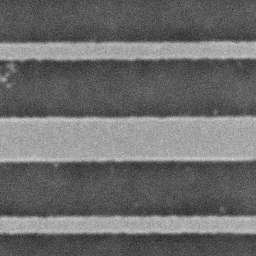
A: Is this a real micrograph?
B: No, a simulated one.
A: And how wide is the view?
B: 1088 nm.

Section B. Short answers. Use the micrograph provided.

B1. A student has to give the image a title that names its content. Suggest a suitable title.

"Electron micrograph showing lines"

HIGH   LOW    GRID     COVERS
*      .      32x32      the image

................................
................................
................................
................................
................................
...*.***************************
********************************
................................
................................
................................
................................
................................
................................
................................
................................
********************************
********************************
********************************
********************************
********************************
................................
................................
................................
................................
................................
................................
................................
********************************
********************************
................................
................................
................................